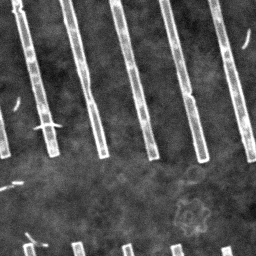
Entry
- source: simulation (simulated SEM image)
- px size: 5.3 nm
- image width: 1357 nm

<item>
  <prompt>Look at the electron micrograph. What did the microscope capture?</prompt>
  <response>parallel lines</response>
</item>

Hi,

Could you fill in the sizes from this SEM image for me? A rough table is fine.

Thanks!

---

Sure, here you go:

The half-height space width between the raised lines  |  207 nanometers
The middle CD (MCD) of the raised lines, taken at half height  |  0.0469 um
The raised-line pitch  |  254 nanometres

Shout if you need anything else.